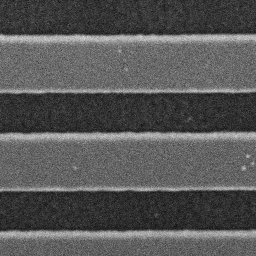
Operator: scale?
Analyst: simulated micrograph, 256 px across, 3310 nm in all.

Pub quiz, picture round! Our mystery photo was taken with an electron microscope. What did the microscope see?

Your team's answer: lines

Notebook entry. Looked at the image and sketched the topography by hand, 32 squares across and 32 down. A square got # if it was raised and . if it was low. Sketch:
................................
................................
................................
................................
############..##################
################################
################################
################################
################################
################################
################################
################################
................................
................................
................................
................................
................................
################################
################################
################################
################################
################################
################################
################################
................................
................................
................................
................................
................................
################################
################################
################################